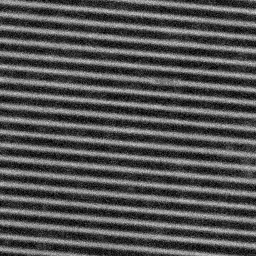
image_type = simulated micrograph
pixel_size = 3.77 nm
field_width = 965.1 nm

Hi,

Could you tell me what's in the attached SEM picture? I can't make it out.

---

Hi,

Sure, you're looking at parallel lines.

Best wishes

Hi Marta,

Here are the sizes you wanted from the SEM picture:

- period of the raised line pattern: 48.8 nm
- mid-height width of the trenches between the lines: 35.1 nanometres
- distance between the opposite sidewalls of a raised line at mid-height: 13.6 nm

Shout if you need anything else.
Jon